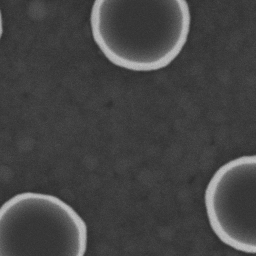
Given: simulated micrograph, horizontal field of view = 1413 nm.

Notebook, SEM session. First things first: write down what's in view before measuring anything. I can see raised bodies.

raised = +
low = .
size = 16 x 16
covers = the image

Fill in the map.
......+++++.....
......++++++....
......+++++.....
.......++++.....
................
................
................
................
................
................
..............++
.............+++
.++..........+++
+++++........+++
+++++.........++
+++++..........+